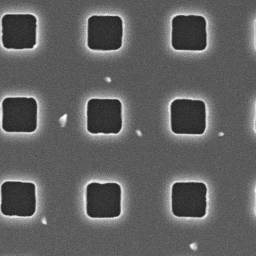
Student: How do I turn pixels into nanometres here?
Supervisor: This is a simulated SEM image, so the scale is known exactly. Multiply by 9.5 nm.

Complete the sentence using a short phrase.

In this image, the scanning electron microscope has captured a regular array of holes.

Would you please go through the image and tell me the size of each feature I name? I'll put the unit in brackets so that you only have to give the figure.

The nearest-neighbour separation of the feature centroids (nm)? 794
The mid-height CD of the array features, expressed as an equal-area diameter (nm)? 365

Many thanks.